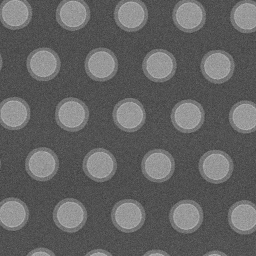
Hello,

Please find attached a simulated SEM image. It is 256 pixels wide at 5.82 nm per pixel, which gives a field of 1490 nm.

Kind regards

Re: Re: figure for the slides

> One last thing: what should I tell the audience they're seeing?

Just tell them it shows an array of small figures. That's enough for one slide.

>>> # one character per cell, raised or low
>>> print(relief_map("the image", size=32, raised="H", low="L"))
HHHHLLLHHHHLLLLHHHLLLLHHHLLLLLHH
HHHHLLLHHHHLLLHHHHLLLLHHHHLLLHHH
HHHHLLLHHHHLLLHHHHLLLLHHHHLLLHHH
LHHLLLLLHHLLLLLHHHLLLLHHHLLLLHHH
LLLLLLLLLLLLLLLLLLLLLLLLLLLLLLLL
LLLLLLLLLLLLLLLLLLLLLLLLLLLLLLLL
LLLLHHHLLLLHHHLLLLLHHLLLLLHHLLLL
LLLHHHHLLLLHHHHLLLHHHHLLLHHHHLLL
LLLHHHHHLLLHHHHLLLHHHHLLLHHHHLLL
LLLLHHHLLLLHHHLLLLHHHHLLLLHHHLLL
LLLLLLLLLLLLLLLLLLLLLLLLLLLLLLLL
LLLLLLLLLLLLLLLLLLLLLLLLLLLLLLLL
LHHLLLLLHHLLLLLHHLLLLLLHLLLLLLLL
HHHHLLLHHHHLLLHHHHLLLLHHHLLLLHHH
HHHHLLLHHHHLLLHHHHLLLHHHHHLLLHHH
HHHLLLLHHHHLLLHHHHLLLLHHHLLLLHHH
LLLLLLLLLLLLLLLLLLLLLLLHLLLLLLHH
LLLLLLLLLLLLLLLLLLLLLLLLLLLLLLLL
LLLLLHLLLLLLLLLLLLLLLLLLLLLLLLLL
LLLHHHHLLLLHHHLLLLHHHLLLLHHHHLLL
LLLHHHHLLLHHHHHLLLHHHHLLLHHHHLLL
LLLHHHHLLLLHHHLLLLHHHHLLLHHHHLLL
LLLLLHLLLLLLHLLLLLLHHLLLLLHHLLLL
LLLLLLLLLLLLLLLLLLLLLLLLLLLLLLLL
LLLLLLLLLLLLLLLLLLLLLLLLLLLLLLLL
HHHLLLLHHHLLLLHHHHLLLLHHHLLLLHHH
HHHHLLLHHHHLLLHHHHLLLHHHHLLLLHHH
HHHLLLLHHHHLLLHHHHLLLHHHHLLLLHHH
HHHLLLLHHHLLLLLHHLLLLLHHHLLLLHHH
LLLLLLLLLLLLLLLLLLLLLLLLLLLLLLLL
LLLLLLLLLLLLLLLLLLLLLLLLLLLLLLLL
LLLLHHHLLLLHHHLLLLHHHLLLLLHHLLLL